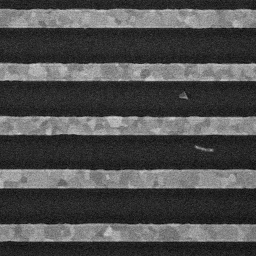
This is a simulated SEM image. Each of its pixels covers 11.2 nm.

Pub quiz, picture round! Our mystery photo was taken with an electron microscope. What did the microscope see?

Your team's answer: lines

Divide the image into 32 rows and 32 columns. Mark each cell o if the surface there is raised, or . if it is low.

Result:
................................
oooooooooooooooooooooooooooooooo
oooooooooooooooooooooooooooooooo
................................
................................
................................
................................
................................
oooooooooooooooooooooooooooooooo
oooooooooooooooooooooooooooooooo
................................
................................
................................
................................
................................
oooooooooooooooooooooooooooooooo
oooooooooooooooooooooooooooooooo
................................
................................
................................
................................
oooooooooooooooooooooooooooooooo
oooooooooooooooooooooooooooooooo
................................
................................
................................
................................
................................
oooooooooooooooooooooooooooooooo
oooooooooooooooooooooooooooooooo
................................
................................